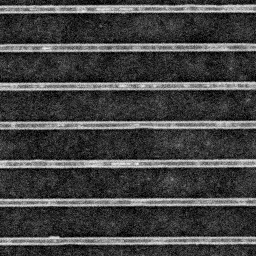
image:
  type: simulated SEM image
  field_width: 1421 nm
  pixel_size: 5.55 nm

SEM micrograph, parallel lines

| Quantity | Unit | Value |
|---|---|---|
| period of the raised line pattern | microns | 0.215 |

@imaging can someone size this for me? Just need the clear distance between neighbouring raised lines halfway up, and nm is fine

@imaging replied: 178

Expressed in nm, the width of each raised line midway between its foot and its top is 37.5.